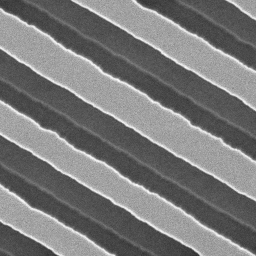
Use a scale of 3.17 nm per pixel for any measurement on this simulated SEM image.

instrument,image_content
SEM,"lines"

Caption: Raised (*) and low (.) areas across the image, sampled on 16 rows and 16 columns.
.....****......*
**.....****.....
***......****...
.****.....****..
..*****.....****
....****......**
......****.....*
**.....*****....
****.....****...
..***......****.
...****.....****
.....***......**
*......***......
***.....****....
.****.....***...
...***......***.